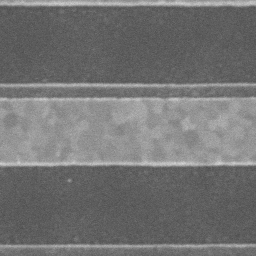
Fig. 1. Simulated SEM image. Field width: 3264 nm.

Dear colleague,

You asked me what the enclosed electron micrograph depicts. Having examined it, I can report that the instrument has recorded lines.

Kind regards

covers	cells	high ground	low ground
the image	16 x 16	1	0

0000000000000000
0000000000000000
0000000000000000
0000000000000000
0000000000000000
1111111111111111
1111111111111111
1111111111111111
1111111111111111
1111111111111111
0000000000000000
0000000000000000
0000000000000000
0000000000000000
0000000000000000
1111111111111111